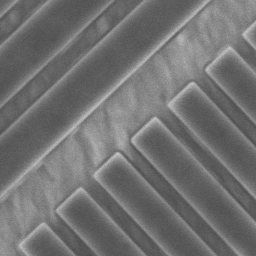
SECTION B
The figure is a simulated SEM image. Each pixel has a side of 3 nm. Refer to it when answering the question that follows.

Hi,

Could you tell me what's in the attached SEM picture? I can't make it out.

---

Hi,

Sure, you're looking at groups of lines, slits or small figures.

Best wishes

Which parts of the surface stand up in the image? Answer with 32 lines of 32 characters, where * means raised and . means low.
**....********....********......
*...*********...*********.......
...*********...*********........
..*********...*********........*
.*********...********..........*
*********...********...........*
*******....********.........**..
******....********.........****.
*****....********.........*****.
****....********..........******
***....********............*****
**....********.........**...****
*....********........*****...***
....********.........******...**
...********...........******...*
..********........**...******...
.********........****...******..
********........******...******.
*******..........******...******
******........*...******...*****
*****........***...******...****
****........*****...******...***
**..........******...******...**
*............******...******...*
.........**...******...******...
........****...******...******..
.......******...******...******.
........******...******...******
....**...******...******...*****
....***...******...******..*****
...*****...******...******..****
...******...******..*******..***